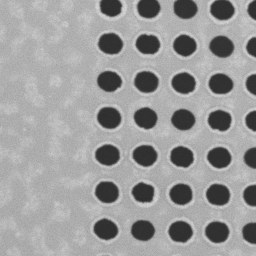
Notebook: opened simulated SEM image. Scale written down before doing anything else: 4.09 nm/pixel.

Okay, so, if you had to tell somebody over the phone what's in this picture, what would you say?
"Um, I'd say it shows a regular array of holes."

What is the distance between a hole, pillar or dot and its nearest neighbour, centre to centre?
151 nanometers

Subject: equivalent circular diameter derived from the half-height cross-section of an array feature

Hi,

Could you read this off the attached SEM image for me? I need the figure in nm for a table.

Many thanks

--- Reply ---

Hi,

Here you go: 89.9